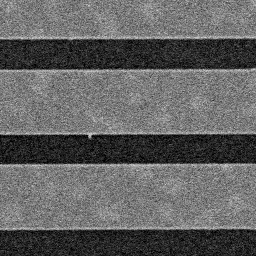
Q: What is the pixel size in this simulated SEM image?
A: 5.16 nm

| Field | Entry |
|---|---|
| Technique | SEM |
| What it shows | one or a few lines or trenches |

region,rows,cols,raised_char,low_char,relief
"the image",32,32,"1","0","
11111111111111111111111111111111
11111111111111111111111111111111
11111111111111111111111111111111
11111111111111111111111111111111
11111111111111111111111111111111
00000000000000000000000000000000
00000000000000000000000000000000
00000000000000000000000000000000
00000000000000000000000000000000
11111111111111111111111111111111
11111111111111111111111111111111
11111111111111111111111111111111
11111111111111111111111111111111
11111111111111111111111111111111
11111111111111111111111111111111
11111111111111111111111111111111
11111111111111111111111111111111
00000000000000000000000000000000
00000000000000000000000000000000
00000000000000000000000000000000
00000000000000000000000000000000
11111111111111111111111111111111
11111111111111111111111111111111
11111111111111111111111111111111
11111111111111111111111111111111
11111111111111111111111111111111
11111111111111111111111111111111
11111111111111111111111111111111
11111111111111111111111111111111
00000000000000000000000000000000
00000000000000000000000000000000
00000000000000000000000000000000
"